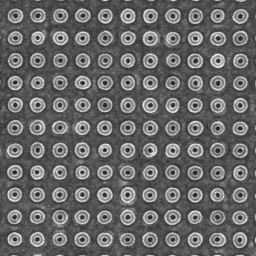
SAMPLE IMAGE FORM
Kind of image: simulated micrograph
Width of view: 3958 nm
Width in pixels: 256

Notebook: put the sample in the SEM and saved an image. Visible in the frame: a regular array of ring-shaped raised bodies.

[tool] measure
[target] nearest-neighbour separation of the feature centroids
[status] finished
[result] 340 nanometers